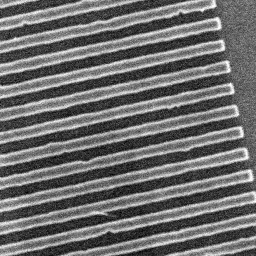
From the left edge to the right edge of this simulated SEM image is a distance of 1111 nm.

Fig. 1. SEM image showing parallel lines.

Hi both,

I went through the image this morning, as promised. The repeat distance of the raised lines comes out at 96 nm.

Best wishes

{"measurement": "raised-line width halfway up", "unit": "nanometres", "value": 47.4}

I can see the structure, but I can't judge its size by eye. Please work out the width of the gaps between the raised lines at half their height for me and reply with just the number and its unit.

50.9 nm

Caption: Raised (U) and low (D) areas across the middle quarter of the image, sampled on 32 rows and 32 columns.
DDDDDDDDDUUUUUUUUUUUUDDDDDDDDDDD
DDDDUUUUUUUUUUUUUDDDDDDDDDDDDDDU
UUUUUUUUUUUUDDDDDDDDDDDDDDUUUUUU
UUUUUUUUDDDDDDDDDDDDDUUUUUUUUUUU
UUDDDDDDDDDDDDDDDUUUUUUUUUUUUUDD
DDDDDDDDDDDDUUUUUUUUUUUUUDDDDDDD
DDDDDDDDUUUUUUUUUUUUDDDDDDDDDDDD
DDDUUUUUUUUUUUUDDDDDDDDDDDDDDUUU
UUUUUUUUUUUDDDDDDDDDDDDDUUUUUUUU
UUUUUUDDDDDDDDDDDDDDUUUUUUUUUUUU
UUDDDDDDDDDDDDDUUUUUUUUUUUUUDDDD
DDDDDDDDDDDUUUUUUUUUUUUDDDDDDDDD
DDDDDDUUUUUUUUUUUUDDDDDDDDDDDDDD
DUUUUUUUUUUUUDDDDDDDDDDDDDDUUUUU
UUUUUUUUUDDDDDDDDDDDDDDDUUUUUUUU
UUUUDDDDDDDDDDDDDDDUUUUUUUUUUUUU
DDDDDDDDDDDDDDUUUUUUUUUUUUUDDDDD
DDDDDDDDDDUUUUUUUUUUUDDDDDDDDDDD
DDDDDUUUUUUUUUUUUDDDDDDDDDDDDDDU
UUUUUUUUUUUUDDDDDDDDDDDDDUUUUUUU
UUUUUUUUDDDDDDDDDDDDDDUUUUUUUUUU
UUUDDDDDDDDDDDDDDUUUUUUUUUUUUUUD
DDDDDDDDDDDDDUUUUUUUUUUUDDDDDDDD
DDDDDDDDUUUUUUUUUUUUDDDDDDDDDDDD
DDUUUUUUUUUUUUUDDDDDDDDDDDDDDDUU
UUUUUUUUUUUDDDDDDDDDDDDDDUUUUUUU
UUUUUUDDDDDDDDDDDDDDDUUUUUUUUUUU
UUDDDDDDDDDDDDDUUUUUUUUUUUUUDDDD
DDDDDDDDDDDUUUUUUUUUUUDDDDDDDDDD
DDDDDDUUUUUUUUUUUUUDDDDDDDDDDDDD
DUUUUUUUUUUUUUDDDDDDDDDDDDDDUUUU
UUUUUUUUUDDDDDDDDDDDDDDUUUUUUUUU